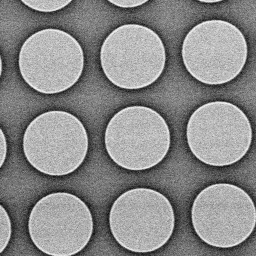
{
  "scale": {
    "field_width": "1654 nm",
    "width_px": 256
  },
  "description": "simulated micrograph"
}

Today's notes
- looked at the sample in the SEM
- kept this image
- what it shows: an array of small figures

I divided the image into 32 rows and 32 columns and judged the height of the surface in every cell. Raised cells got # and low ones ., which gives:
...#####......####..............
................................
................................
...............###......######..
....#####.....######...#######..
...#######...#######...########.
...#######...########..########.
..########...########..########.
...#######...#######...#######..
...#######...#######....#####...
....#####.....#####.............
.....##.........................
................................
................##.......#####..
.....####.....######....#######.
....######....#######...#######.
...########..########..########.
#..########..########...#######.
#..########..########...#######.
#..########...######.....#####..
....######.....####.......###...
.....####.......................
................................
..........................####..
......###......#####.....######.
.....######...#######...########
#...#######...########..########
#...#######...########..########
#...########..########..########
#...#######...#######....######.
#...#######....#####......####..
......####......................